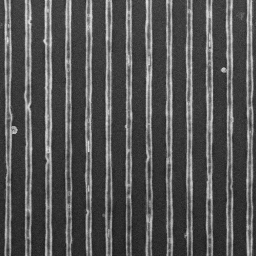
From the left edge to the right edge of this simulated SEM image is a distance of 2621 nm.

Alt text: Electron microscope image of parallel lines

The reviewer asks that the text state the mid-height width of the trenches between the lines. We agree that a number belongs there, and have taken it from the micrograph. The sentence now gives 158 nanometers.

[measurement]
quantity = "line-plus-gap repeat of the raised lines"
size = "0.207 um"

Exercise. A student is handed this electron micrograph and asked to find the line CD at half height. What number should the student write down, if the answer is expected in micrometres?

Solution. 0.0499